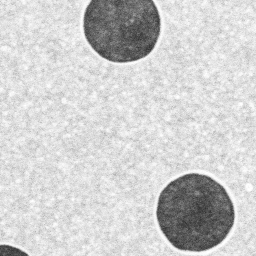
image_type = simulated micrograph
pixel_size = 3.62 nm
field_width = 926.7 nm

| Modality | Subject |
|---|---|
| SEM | holes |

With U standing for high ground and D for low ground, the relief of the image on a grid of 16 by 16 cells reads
UUUUUDDDDDUUUUUU
UUUUUDDDDDUUUUUU
UUUUUDDDDDUUUUUU
UUUUUUDDDUUUUUUU
UUUUUUUUUUUUUUUU
UUUUUUUUUUUUUUUU
UUUUUUUUUUUUUUUU
UUUUUUUUUUUUUUUU
UUUUUUUUUUUUUUUU
UUUUUUUUUUUUUUUU
UUUUUUUUUUUUUUUU
UUUUUUUUUUDDDDUU
UUUUUUUUUUDDDDDU
UUUUUUUUUUDDDDDU
UUUUUUUUUUDDDDUU
DUUUUUUUUUUDDUUU